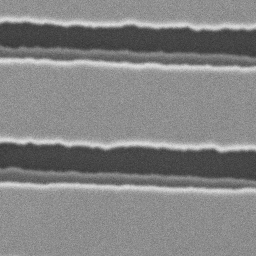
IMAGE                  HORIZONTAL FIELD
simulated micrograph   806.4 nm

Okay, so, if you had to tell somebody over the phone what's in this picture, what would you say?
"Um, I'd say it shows lines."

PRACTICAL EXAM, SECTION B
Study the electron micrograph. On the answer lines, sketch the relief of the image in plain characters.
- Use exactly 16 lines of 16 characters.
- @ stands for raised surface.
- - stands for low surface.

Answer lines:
@@@@@@@@@@@@@@@@
---@@@@@@@@@@@@@
----------------
----------------
@@@@@@@@@@@@@@@@
@@@@@@@@@@@@@@@@
@@@@@@@@@@@@@@@@
@@@@@@@@@@@@@@@@
@@@@@@@@@@@@@@@@
----------------
----------------
@@-@@-----------
@@@@@@@@@@@@@@@@
@@@@@@@@@@@@@@@@
@@@@@@@@@@@@@@@@
@@@@@@@@@@@@@@@@